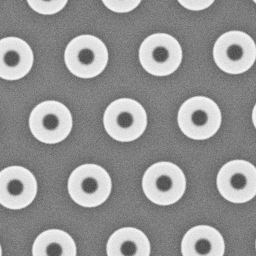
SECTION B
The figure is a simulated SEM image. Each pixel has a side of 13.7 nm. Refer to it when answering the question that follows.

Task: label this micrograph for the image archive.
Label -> an array of small figures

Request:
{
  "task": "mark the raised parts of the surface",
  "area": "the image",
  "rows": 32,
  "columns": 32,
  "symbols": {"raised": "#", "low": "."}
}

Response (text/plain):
....####.....####......###......
.....##.........................
................................
................................
..........#........##.......###.
###......####.....####.....#####
####....#####....######....#####
####....#####....######....#####
####.....####.....####......###.
###.......##....................
................................
................................
...............##.......##......
....####.....#####.....####.....
....#####....#####....######....
....#####....#####....######....
....#####....#####.....####.....
.....###.......##...............
................................
................................
...................###......###.
####.....####.....#####....#####
####.....#####....#####....#####
#####....#####....#####....#####
####.....####.....#####.....####
####......##........#...........
................................
................................
........................###.....
.....####.....####.....#####....
....#####....######....#####....
....#####....######....#####....